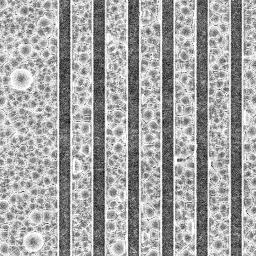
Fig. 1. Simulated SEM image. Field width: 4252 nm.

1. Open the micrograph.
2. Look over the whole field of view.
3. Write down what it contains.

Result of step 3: parallel lines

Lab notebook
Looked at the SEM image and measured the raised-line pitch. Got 567 nm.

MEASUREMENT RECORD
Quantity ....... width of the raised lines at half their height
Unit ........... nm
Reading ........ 368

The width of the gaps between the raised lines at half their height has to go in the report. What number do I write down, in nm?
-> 212